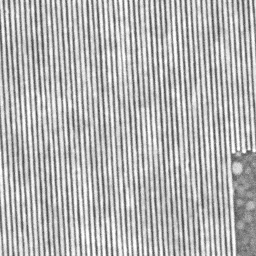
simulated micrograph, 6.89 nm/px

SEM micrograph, parallel lines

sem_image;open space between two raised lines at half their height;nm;19.8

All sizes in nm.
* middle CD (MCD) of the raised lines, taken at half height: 15.5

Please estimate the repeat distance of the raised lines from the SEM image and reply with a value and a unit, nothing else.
35.8 nm